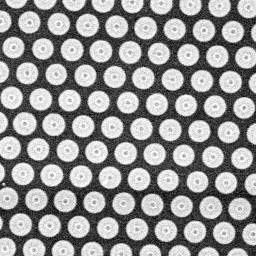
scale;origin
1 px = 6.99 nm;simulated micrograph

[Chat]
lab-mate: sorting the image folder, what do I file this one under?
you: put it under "an array of small figures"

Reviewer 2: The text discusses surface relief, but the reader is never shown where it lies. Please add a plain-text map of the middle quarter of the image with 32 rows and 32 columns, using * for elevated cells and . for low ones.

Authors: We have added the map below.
....***.........................
...*****...****...****....**....
*..*****..*****..*****...****...
*..*****..*****..*****...*****..
...****...*****..*****...*****..
....**.....***....****...****...
...........................*....
****...***.....**......*........
****..*****...****...****....***
****..*****..******..*****..****
****..*****..*****...*****..****
***....***....****...*****..****
......................***....***
...***.....**...................
..*****...****...****....***....
..*****..******..*****..*****..*
..*****..******..*****..*****..*
...****...****...*****..*****..*
..................***....***....
***....**.......................
***...****...****....***.....**.
****.******..*****..*****...****
***..******..*****..*****..*****
***...****...*****..*****..*****
.......**.....***....***....****
................................
..****....***....***......*.....
..*****..*****..*****...****....
.******..*****..*****..******..*
..*****..*****..*****..******..*
...**.....***....****...****...*
..................*......**.....